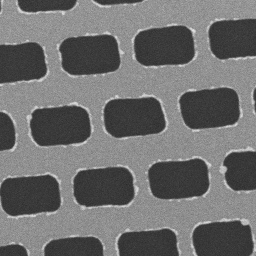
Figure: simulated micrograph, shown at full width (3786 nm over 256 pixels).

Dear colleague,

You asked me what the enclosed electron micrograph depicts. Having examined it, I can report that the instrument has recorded holes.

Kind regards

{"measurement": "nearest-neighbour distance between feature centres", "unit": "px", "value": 75.1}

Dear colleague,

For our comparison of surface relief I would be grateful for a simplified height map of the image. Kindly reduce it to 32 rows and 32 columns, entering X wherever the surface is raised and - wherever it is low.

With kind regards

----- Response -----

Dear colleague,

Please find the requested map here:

XX-------XXXX---XXXXXXXXXXXXXXXX
XXX--XXXXXXXXXXXXXXXXXXXXXXXXXXX
XXXXXXXXXXXXXXXXXXXXXXXXXXXX----
XXXXXXXXXXXXXXXXXXXX---XXX------
XXXXXXXXXXX---XXX-------XX------
XX---XXX-------XX-------XX------
-----XX--------XX-------XX------
------XX-------XX-------XXXXXXXX
------XX-------XXXXXXXXXXXXXXXXX
-----XXXXXXXXXXXXXXXXXXXXXXXXXXX
XXXXXXXXXXXXXXXXXXXXXXXXXXXXXXXX
XXXXXXXXXXXXXXXXXXXXXXXX-----XXX
XXXXXXXXXXXXXX------XX--------XX
XXXXXX----XXX-------XXX-------XX
-XXX-------XX--------XX-------XX
--XX-------XX--------XX------XXX
--XX-------XX-------XXXXXXXXXXXX
--XX-------XXXXXXXXXXXXXXXXXXXXX
-XXXXXXXXXXXXXXXXXXXXXXXXXXXXXXX
XXXXXXXXXXXXXXXXXXXXXXXXXXXX----
XXXXXXXXXXXXXXXXXXX-------XX----
XXXXXXXXXX------XXX-------XX----
X------XX--------XX-------XX----
-------XX--------XX-------XXX---
--------X--------XX------XXXXXXX
--------XX------XXXXXXXXXXXXXXXX
X-----XXXXXXXXXXXXXXXXXXXXXXXXXX
XXXXXXXXXXXXXXXXXXXXXXXXXXXXXXXX
XXXXXXXXXXXXXXXXXXXXXXXX-------X
XXXXXXXXXXXXXXX-------XX-------X
XXXXXX-------XX-------XX--------
---XXX-------XX-------XX--------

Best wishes